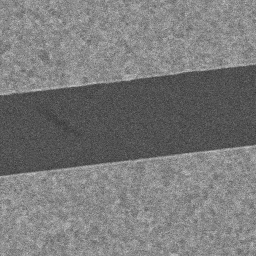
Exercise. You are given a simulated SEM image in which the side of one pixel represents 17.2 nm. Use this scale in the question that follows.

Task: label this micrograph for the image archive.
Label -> one or a few lines or trenches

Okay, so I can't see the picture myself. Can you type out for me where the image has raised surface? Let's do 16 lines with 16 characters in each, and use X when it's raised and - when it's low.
XXXXXXXXXXXXXXXX
XXXXXXXXXXXXXXXX
XXXXXXXXXXXXXXXX
XXXXXXXXXXXXXXXX
XXXXXXXXXXX-----
XXX-------------
----------------
----------------
----------------
-------------XXX
-----XXXXXXXXXXX
XXXXXXXXXXXXXXXX
XXXXXXXXXXXXXXXX
XXXXXXXXXXXXXXXX
XXXXXXXXXXXXXXXX
XXXXXXXXXXXXXXXX